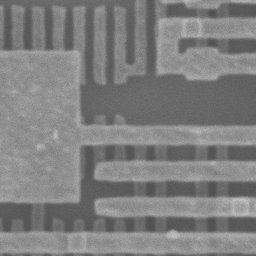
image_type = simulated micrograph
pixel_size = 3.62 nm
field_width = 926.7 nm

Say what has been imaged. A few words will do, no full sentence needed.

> wiring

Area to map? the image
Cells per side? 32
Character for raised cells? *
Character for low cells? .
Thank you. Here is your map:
.......................*****....
................................
....................************
....................************
....................************
....................**..........
**********..........**.****.....
**********..........************
**********..........************
**********.............****.....
**********......................
**********......................
**********......................
**********......................
**********......................
**********......................
********************************
********************************
**********......................
**********......................
**********..********************
**********..********************
**********...*******************
**********......................
**********......................
............********************
............********************
................................
................................
********************************
********************************
********************************